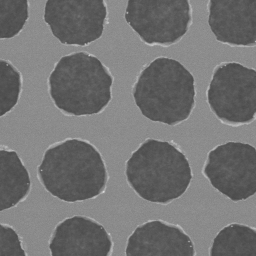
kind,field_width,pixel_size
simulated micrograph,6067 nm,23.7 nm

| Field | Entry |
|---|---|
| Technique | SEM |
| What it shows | holes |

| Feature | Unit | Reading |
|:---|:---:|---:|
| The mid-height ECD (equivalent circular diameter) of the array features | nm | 1490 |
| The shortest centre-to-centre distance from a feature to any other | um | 1.96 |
